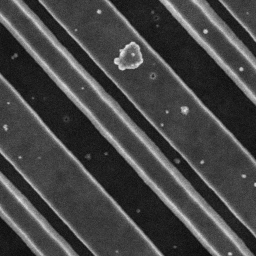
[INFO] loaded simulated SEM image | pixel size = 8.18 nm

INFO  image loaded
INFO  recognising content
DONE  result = lines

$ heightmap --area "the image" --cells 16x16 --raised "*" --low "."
*******....*****
********....****
.********...****
..********...***
...********...**
*...********...*
**...********...
***...********..
***....*******..
****....*******.
*****....*******
******...*******
*******...******
********...*****
.********...****
..********...***